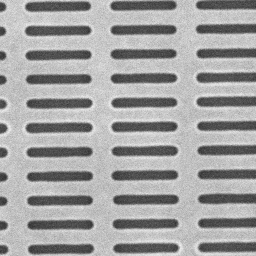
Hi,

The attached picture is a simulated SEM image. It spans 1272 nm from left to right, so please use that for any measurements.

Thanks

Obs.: groups of lines, slits or small figures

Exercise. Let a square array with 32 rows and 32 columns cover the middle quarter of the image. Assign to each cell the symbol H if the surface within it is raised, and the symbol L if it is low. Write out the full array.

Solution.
HHHHHHHHHHHHHHHHHHHHHHHHHHHHHHHH
HHHHHHHHHHHHHHHHHHHHHHHHHHHHHHHH
LLLLLLHHHHHHLLLLLLLLLLLLLLLLHHHH
LLLLLLLHHHHLLLLLLLLLLLLLLLLLHHHH
LLLLLLLHHHHHLLLLLLLLLLLLLLLLHHHH
HHHHHHHHHHHHHHHHHHHHHHHHHHHHHHHH
HHHHHHHHHHHHHHHHHHHHHHHHHHHHHHHH
HHHHHHHHHHHHHHHHHHHHHHHHHHHHHHHH
HHLLLLHHHHHHHLLLLLLLLLLLLLLHHHHH
LLLLLLLHHHHHLLLLLLLLLLLLLLLLLHHH
LLLLLLLHHHHHLLLLLLLLLLLLLLLLHHHH
HHHHHHHHHHHHHHHHHHHHHHHHHHHHHHHH
HHHHHHHHHHHHHHHHHHHHHHHHHHHHHHHH
HHHHHHHHHHHHHHHHHHHHHHHHHHHHHHHH
LLLLLLHHHHHHLLLLLLLLLLLLLLLLHHHH
LLLLLLLHHHHHLLLLLLLLLLLLLLLLLHHH
LLLLLLLHHHHHLLLLLLLLLLLLLLLLHHHH
HHHHHHHHHHHHHHHHHHHHHHHHHHHHHHHH
HHHHHHHHHHHHHHHHHHHHHHHHHHHHHHHH
HHHHHHHHHHHHHHHHHHHHHHHHHHHHHHHH
HHHHHHHHHHHHHLLLLLLLLLLLLLLLHHHH
LLLLLLLHHHHHLLLLLLLLLLLLLLLLLHHH
LLLLLLLHHHHHLLLLLLLLLLLLLLLLHHHH
HHHHHHHHHHHHHHHHHHHHHHHHHHHHHHHH
HHHHHHHHHHHHHHHHHHHHHHHHHHHHHHHH
HHHHHHHHHHHHHHHHHHHHHHHHHHHHHHHH
HHHHHHHHHHHHHLLLLLLLLLLLLLLLHHHH
LLLLLLLHHHHHLLLLLLLLLLLLLLLLLHHH
LLLLLLLHHHHHLLLLLLLLLLLLLLLLHHHH
HHHHHHHHHHHHHHHHHHHHHHHHHHHHHHHH
HHHHHHHHHHHHHHHHHHHHHHHHHHHHHHHH
HHHHHHHHHHHHHHHHHHHHHHHHHHHHHHHH